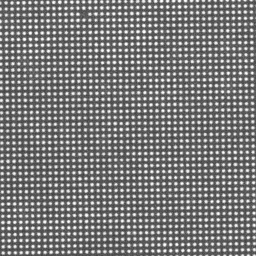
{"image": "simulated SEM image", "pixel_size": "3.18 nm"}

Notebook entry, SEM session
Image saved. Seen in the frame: a regular array of raised bodies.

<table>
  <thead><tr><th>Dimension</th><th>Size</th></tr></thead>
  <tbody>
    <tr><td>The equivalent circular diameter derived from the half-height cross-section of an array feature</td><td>8.8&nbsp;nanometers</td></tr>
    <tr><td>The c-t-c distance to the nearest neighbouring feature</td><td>18.4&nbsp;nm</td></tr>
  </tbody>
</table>